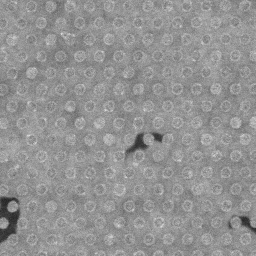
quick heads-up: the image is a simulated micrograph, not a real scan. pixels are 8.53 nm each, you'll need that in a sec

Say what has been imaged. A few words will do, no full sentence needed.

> a regular array of raised bodies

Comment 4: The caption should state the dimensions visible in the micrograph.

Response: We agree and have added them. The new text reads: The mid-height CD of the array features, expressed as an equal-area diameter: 88.8 nm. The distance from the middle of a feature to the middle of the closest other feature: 162 nm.